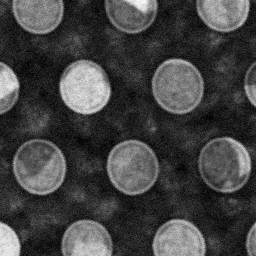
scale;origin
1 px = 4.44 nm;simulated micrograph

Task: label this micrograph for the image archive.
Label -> raised bodies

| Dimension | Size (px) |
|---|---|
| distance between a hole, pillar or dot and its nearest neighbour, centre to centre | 91.9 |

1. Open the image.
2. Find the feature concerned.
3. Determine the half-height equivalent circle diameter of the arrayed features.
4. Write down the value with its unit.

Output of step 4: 0.227 um